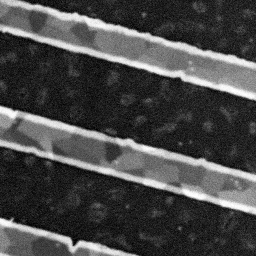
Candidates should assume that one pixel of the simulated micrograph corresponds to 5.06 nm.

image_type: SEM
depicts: one or a few lines or trenches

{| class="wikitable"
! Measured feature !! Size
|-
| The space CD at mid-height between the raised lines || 392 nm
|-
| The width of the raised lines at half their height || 160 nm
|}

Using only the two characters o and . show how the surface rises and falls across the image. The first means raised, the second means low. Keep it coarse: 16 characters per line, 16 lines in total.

oo..............
oooooo..........
...ooooooo......
......oooooooo..
..........oooooo
..............oo
................
ooo.............
oooooo..........
..oooooooo......
......oooooooo..
..........oooooo
.............ooo
................
oo..............
oooooo..........